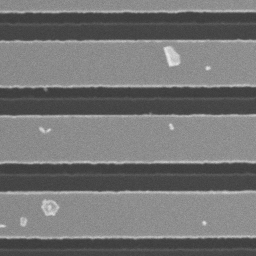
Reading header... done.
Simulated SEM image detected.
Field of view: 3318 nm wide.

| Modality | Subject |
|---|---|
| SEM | lines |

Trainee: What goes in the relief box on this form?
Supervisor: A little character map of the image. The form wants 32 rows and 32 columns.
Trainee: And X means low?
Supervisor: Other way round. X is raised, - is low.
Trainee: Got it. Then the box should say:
XXXXXXXXXXXXXXXXXXXXXXXXXXXXXXXX
XXXXXXXX--XXXXXXXXXXXX----------
--------------------------------
--------------------------------
--------------------------------
XXXXXXXXXXXXXXXXXXXXXXXXXXXXXXXX
XXXXXXXXXXXXXXXXXXXXXXXXXXXXXXXX
XXXXXXXXXXXXXXXXXXXXXXXXXXXXXXXX
XXXXXXXXXXXXXXXXXXXXXXXXXXXXXXXX
XXXXXXXXXXXXXXXXXXXXXXXXXXXXXXXX
XXXXXXXXXXXXXXXXXXXXXXXXXXXXXXXX
--------------------------------
--------------------------------
--------------------------------
XXXXXXXXXXXXXXXXXXXXXXXXXXXXXXXX
XXXXXXXXXXXXXXXXXXXXXXXXXXXXXXXX
XXXXXXXXXXXXXXXXXXXXXXXXXXXXXXXX
XXXXXXXXXXXXXXXXXXXXXXXXXXXXXXXX
XXXXXXXXXXXXXXXXXXXXXXXXXXXXXXXX
XXXXXXXXXXXXXXXXXXXXXXXXXXXXXXXX
--------------------------------
--------------------------------
--------------------------------
--------------------------------
XXXXXXXXXXXXXXXXXXXXXXXXXXXXXXXX
XXXXXXXXXXXXXXXXXXXXXXXXXXXXXXXX
XXXXXXXXXXXXXXXXXXXXXXXXXXXXXXXX
XXXXXXXXXXXXXXXXXXXXXXXXXXXXXXXX
XXXXXXXXXXXXXXXXXXXXXXXXXXXXXXXX
XXXXXXXXXXXXXXXXXXXXXXXXXXXXXXXX
--------------------------------
--------------------------------